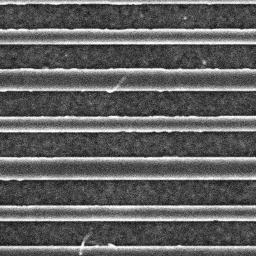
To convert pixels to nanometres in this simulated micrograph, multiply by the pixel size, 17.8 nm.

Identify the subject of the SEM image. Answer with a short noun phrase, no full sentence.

lines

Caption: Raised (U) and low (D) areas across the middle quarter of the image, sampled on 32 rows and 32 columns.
DDDDDDDDDDDDDDDDDDDDDDDDDDDDDDDD
UUUUUUUUUUUUUUUUUUUUUUUUUUUUUUUU
UUUUUUUUUUUUUUUUUUUUUUUUUUUUUUUU
UUUUUUUUUUUUUUUUUUUUUUUUUUUUUUUU
UUUUUUUUUUUUUUUUUUUUUUUUUUUUUUUU
UUUUUUUUUUUUUUUUUUUUUUUUUUUUUUUU
UUUUUUUUUUUUUUUUUUUUUUUUUUUUUUUU
DDDDDDDDDDDDDDDDDDDDDDDDDDDDDDDD
DDDDDDDDDDDDDDDDDDDDDDDDDDDDDDDD
DDDDDDDDDDDDDDDDDDDDDDDDDDDDDDDD
DDDDDDDDDDDDDDDDDDDDDDDDDDDDDDDD
DDDDDDDDDDDDDDDDDDDDDDDDDDDDDDDD
DDDDDDDDDDDDDDDDDDDDDDDDDDDDDDDD
UUUUUUUUUUUUUUUUUUUUUUUUUUUUUUUU
UUUUUUUUUUUUUUUUUUUUUUUUUUUUUUUU
UUUUUUUUUUUUUUUUUUUUUUUUUUUUUUUU
UUUUUUUUUUUUUUUUUUUUUUUUUUUUUUUU
DDDDDDDDDDDDDDDDDDDDDDDDDDDDDDDD
DDDDDDDDDDDDDDDDDDDDDDDDDDDDDDDD
DDDDDDDDDDDDDDDDDDDDDDDDDDDDDDDD
DDDDDDDDDDDDDDDDDDDDDDDDDDDDDDDD
DDDDDDDDDDDDDDDDDDDDDDDDDDDDDDDD
DDDDDDDDDDDDDDDDDDDDDDDDDDDDDDDD
UUUUUUUUUUUUUUUUUUUUUUUUUUUUUUUU
UUUUUUUUUUUUUUUUUUUUUUUUUUUUUUUU
UUUUUUUUUUUUUUUUUUUUUUUUUUUUUUUU
UUUUUUUUUUUUUUUUUUUUUUUUUUUUUUUU
UUUUUUUUUUUUUUUUUUUUUUUUUUUUUUUU
UUUUUUUUUUUUUUUUUUUUUUUUUUUUUUUU
DDDDDDDDDDDDDDDDDDDDDDDDDDDDDDDD
DDDDDDDDDDDDDDDDDDDDDDDDDDDDDDDD
DDDDDDDDDDDDDDDDDDDDDDDDDDDDDDDD